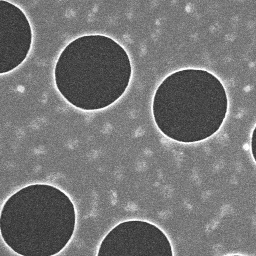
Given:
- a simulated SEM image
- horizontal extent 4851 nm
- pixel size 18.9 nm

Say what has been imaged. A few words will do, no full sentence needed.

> holes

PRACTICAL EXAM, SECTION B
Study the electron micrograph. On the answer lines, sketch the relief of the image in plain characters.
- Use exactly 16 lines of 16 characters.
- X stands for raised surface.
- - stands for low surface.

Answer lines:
-XXXXXXXXXXXXXXX
--XXXXXXXXXXXXXX
--XXX--XXXXXXXXX
--XX----XXXXXXXX
XXX-----XXX--XXX
XXXX----XX----XX
XXXXX--XXX----XX
XXXXXXXXXX----XX
XXXXXXXXXX---XXX
XXXXXXXXXXXXXXXX
XXXXXXXXXXXXXXXX
XXXXXXXXXXXXXXXX
X---XXXXXXXXXXXX
-----XXXXXXXXXXX
-----XX---XXXXXX
X---XX-----XXXXX